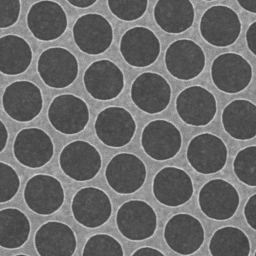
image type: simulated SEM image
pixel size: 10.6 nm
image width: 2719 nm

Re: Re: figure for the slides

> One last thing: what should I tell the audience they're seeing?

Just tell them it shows a regular array of holes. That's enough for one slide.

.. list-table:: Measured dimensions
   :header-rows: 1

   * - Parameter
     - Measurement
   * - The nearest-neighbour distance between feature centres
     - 506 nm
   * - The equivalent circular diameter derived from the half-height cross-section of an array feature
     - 0.43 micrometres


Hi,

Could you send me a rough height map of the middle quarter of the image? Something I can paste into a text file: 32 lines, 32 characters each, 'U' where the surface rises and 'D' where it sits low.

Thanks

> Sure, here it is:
DDDDUUDDDDDDDUUUUDDDDUUUUDDDDDDD
DDDDUDDDDDDDDDUUUUUUUUUUUUDDDDDD
DDDUUDDDDDDDDDDUUUUDDDDUUUUDDDDD
DDDUUDDDDDDDDDDUUUDUDDDDDUUUDDDD
DDUUUDDDDDDDDDDUUDDDDDDDDDUUUUUU
DUUUUDDDDDDDDDDUUDDDDDDDDDUUUUUU
UUUUUUDDDDDDDDDUUDDDDDDDDDDUUUDD
DUUUUUDDDDDDDDUUUDDDDDDDDDDUUDDD
DDDDUUUUDDDDDUUUUDDDDDDDDDDUDDDD
DDDDDUUUUUUUUUUUUDDDDDDDDDUUDDDD
DDDDDDUUUUUUUUUUUUDDDDDDDDUUDDDD
DDDDDDUUUUDDDDDDUUUDDDDDDUUUDDDD
DDDDDDUUUDDDDDDDDUUUUDUUUUUUUDDD
DDDDDDUUDDDDDDDDDUUUUUUUUUUUUDDD
DDDDDDUUDDDDDDDDDDUUUUDDDDUUUUDD
DDDDDUUUDDDDDDDDDDUUDDDDDDDDUUUU
DDDDDUUUDDDDDDDDDDUUDDDDDDDDDUUU
DDDUUUUUDDDDDDDDDUUUDDDDDDDDDUUU
UUUUUUUUDDDDDDDDDUUDDDDDDDDDDUUU
UUDDDDUUUUDDDDDDUUUDDDDDDDDDDUUU
DDDDDDDUUUUDDDDUUUUUDDDDDDDDDUUD
DDDDDDDDUUUUUUUUUUUUDDDDDDDDDUUD
DDDDDDDDDUUUUUDDDUUUUDDDDDDDUUUD
DDDDDDDDDUUUDDDDDDDUUUDDDDDUUUUD
DDDDDDDDDUUDDDDDDDDDUUUUUUUUUUUD
DDDDDDDDDUUDDDDDDDDDUUUUUUUUUUUU
DDDDDDDDDUDDDDDDDDDDDUUUDDDDDDUU
DDDDDDDDUUDDDDDDDDDDDUUDDDDDDDDU
UUDDDDDUUUUDDDDDDDDDUUUDDDDDDDDD
UUUUUUUUUUUDDDDDDDDDUUDDDDDDDDDD
UUUUUUUUUUUDDDDDDDDDUUDDDDDDDDDD
UUUUDDDDDUUUUDDDDDUUUUDDDDDDDDDD